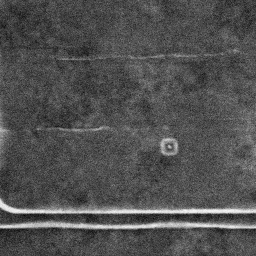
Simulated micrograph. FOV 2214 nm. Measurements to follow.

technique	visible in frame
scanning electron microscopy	wiring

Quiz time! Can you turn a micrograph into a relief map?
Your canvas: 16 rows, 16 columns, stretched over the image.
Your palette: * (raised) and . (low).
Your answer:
****************
****************
****************
****************
****************
****************
****************
****************
****************
****************
****************
****************
****************
................
................
................